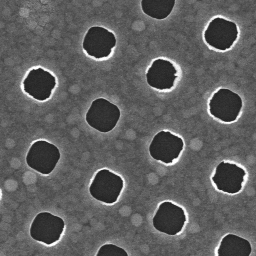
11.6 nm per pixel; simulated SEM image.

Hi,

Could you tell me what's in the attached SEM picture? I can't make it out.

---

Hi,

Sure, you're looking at a regular array of holes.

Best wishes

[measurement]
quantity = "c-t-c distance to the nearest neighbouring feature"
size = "819 nanometers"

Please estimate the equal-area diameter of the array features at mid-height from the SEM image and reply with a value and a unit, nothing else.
371 nm